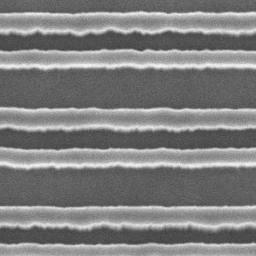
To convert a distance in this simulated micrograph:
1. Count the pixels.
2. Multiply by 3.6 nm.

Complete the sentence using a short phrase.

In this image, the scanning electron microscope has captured lines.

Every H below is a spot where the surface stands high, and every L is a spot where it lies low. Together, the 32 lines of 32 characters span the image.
LLLLLLLLLLLLLLLLLLLLLLLLLLLLLLLL
LLLLLLLLLLLLLLLLLLLLLLLLLLLLLLLL
HHHHHHHHHHHHHHHHHHHHHHHHHHHHHHHH
HHHHHHHHHHHHHHHHHHHHHHHHHHHHHHHH
LLLLLLLLLLLLLLLLLLLLLLLLLLLLLLLL
LLLLLLLLLLLLLLLLLLLLLLLLLLLLLLLL
HHHHHHHHHHHHHHHHHHHHHHHHHHHHHHHH
HHHHHHHHHHHHHHHHHHHHHHHHHHHHHHHH
LLLLLLLLLLLLLLLLLLLLLLLLLLLLLLLL
LLLLLLLLLLLLLLLLLLLLLLLLLLLLLLLL
LLLLLLLLLLLLLLLLLLLLLLLLLLLLLLLL
LLLLLLLLLLLLLLLLLLLLLLLLLLLLLLLL
LLLLLLLLLLLLLLLLLLLLLLLLLLLLLLLL
LLLLLLLLLLLLLLLLLLLLLLLLLLLLLLLL
HHHHHHHHHHHHHHHHHHHHHHHHHHHHHHHH
HHHHHHHHHHHHHHHHHHHHHHHHHHHHHHHH
LLLLLLLLLLLLLLLLLLLLLLLLLLLLLLLL
LLLLLLLLLLLLLLLLLLLLLLLLLLLLLLLL
LLLLLLLLLLLLLLLLLLLLLLLLLLLLLLLL
HHHHHHHHHHHHHHHHHHHHHHHHHHHHHHHH
LHHHHHHHHHHHHHHHHHHHHHHHHHHHHHHH
LLLLLLLLLLLLLLLLLLLLLLLLLLLLLLLL
LLLLLLLLLLLLLLLLLLLLLLLLLLLLLLLL
LLLLLLLLLLLLLLLLLLLLLLLLLLLLLLLL
LLLLLLLLLLLLLLLLLLLLLLLLLLLLLLLL
LLLLLLLLLLLLLLLLLLLLLLLLLLLLLLLL
HHHHHHHHHHHHHHHHHHHHHHHHHHHHHHHH
HHHHHHHHHHHHHHHHHHHHHHHHHHHHHHHH
LLLLLLLLLLHLLLLLLLLLLLLLLLHLLLLL
LLLLLLLLLLLLLLLLLLLLLLLLLLLLLLLL
LLLHLLLLLLLLLLLLLLLLLLLHHHLLLLLH
HHHHHHHHHHHHHHHHHHHHHHHHHHHHHHHH